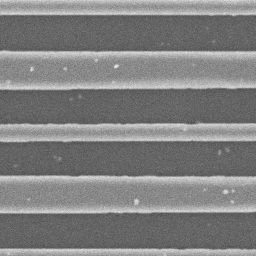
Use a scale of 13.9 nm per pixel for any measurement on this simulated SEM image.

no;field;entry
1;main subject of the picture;lines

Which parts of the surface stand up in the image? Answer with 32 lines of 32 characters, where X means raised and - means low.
XXXXXXXXXXXXXXXXXXXXXXXXXXXXXXXX
XXXXXXXXXXXXXXXXXXXXXXXXXXXXXXXX
--------------------------------
--------------------------------
--------------------------------
--------------------------------
XXXXXXXXXXXXXXXXXXXXXXXXXXXXXXXX
XXXXXXXXXXXXXXXXXXXXXXXXXXXXXXXX
XXXXXXXXXXXXXXXXXXXXXXXXXXXXXXXX
XXXXXXXXXXXXXXXXXXXXXXXXXXXXXXXX
XXXXXXXXXXXXXXXXXXXXXXXXXXXXXXXX
--------------------------------
--------------------------------
--------------------------------
--------------------------------
--------------------------------
XXXXXXXXXXXXXXXXXXXXXXXXXXXXXXXX
XXXXXXXXXXXXXXXXXXXXXXXX-XXXXXXX
--------------------------------
--------------------------------
--------------------------------
--------------------------------
XXXXXXXXXXXXXXXXXXXXXXXXXXXXXXXX
XXXXXXXXXXXXXXXXXXXXXXXXXXXXXXXX
XXXXXXXXXXXXXXXXXXXXXXXXXXXXXXXX
XXXXXXXXXXXXXXXXXXXXXXXXXXXXXXXX
XXXXXXXXXXXXXXXX-XX-------------
--------------------------------
--------------------------------
--------------------------------
--------------------------------
XXXXXXXXXXXXXXXXXXXXXXXXXXXXXXXX